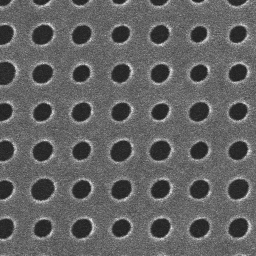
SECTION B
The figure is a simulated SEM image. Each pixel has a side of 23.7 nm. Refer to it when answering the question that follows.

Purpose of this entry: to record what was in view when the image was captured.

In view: a regular array of holes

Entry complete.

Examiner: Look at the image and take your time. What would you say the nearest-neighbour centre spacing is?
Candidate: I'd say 917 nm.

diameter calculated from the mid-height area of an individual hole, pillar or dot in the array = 19.7 pixels